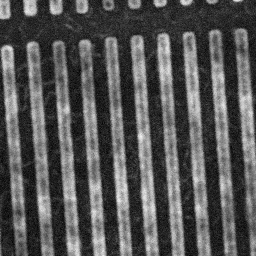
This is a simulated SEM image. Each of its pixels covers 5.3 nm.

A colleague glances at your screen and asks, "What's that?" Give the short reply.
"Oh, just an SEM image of parallel lines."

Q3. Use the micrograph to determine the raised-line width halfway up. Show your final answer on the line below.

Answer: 0.0489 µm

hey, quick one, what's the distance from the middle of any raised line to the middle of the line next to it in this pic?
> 26.1 px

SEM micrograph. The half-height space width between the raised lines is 0.0886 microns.